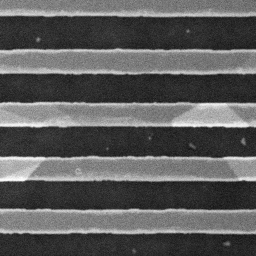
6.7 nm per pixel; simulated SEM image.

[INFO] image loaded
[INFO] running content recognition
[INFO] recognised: lines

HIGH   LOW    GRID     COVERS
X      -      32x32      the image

XXXXXXXXXXXXXXXXXXXXXXXXXXXXXXXX
XXXXXXXXXXXXXXXXXXXXXXXXXXXXXXXX
--------------------------------
--------------------------------
--------------------------------
--------------------------------
XXXXXXXXXXXXXXXXXXXXXXXXXXX-XXXX
XXXXXXXXXXXXXXXXXXXXXXXXXXXXXXXX
XXXXXXXXXXXXXXXXXXXXXXXXXXXXXXXX
--------------------------------
--------------------------------
--------------------------------
--------------------------------
XXXXXXXXXXXXXXXXXXXXXXXXXXXXXXXX
XXXXXXXXXXXXXXXXXXXXXXXXXXXXXXXX
XXXXXX----------XXXXXXXXXXXXXXXX
--------------------------------
--------------------------------
--------------------------------
--------------------------------
XXXXXXXXXXXXXXXXXXXXXXXXXXXXXXXX
XXXXXXXXXXXXXXXXXXXXXXXXXXXXXXXX
---------------------------XX---
--------------------------------
--------------------------------
--------------------------------
XXXXXXXXXXXXXXXXXXXXXXXXXXXXXXXX
XXXXXXXXXXXXXXXXXXXXXXXXXXXXXXXX
XXXXXXXXXXXXXXXXXXXXXXXXXXXXXXXX
--------------------------------
--------------------------------
--------------------------------